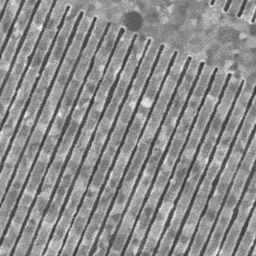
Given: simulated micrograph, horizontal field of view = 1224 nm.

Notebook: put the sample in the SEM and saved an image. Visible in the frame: parallel lines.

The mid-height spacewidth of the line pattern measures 21.5 nm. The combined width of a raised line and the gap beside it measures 69.8 nanometers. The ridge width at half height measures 47.9 nm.